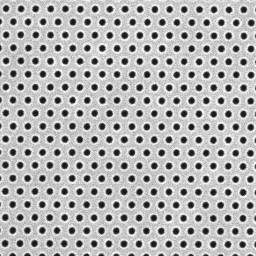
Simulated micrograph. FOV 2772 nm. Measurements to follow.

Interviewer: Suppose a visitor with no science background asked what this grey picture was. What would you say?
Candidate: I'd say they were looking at a regular array of holes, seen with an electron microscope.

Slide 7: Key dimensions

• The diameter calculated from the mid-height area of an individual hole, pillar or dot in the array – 74.3 nm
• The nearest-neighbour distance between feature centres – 0.159 um